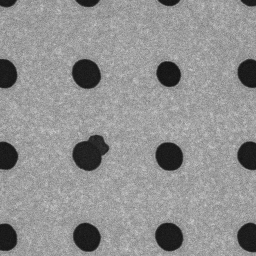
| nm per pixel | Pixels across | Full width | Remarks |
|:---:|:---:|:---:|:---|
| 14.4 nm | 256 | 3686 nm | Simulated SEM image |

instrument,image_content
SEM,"holes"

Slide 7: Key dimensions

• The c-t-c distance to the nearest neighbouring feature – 1150 nm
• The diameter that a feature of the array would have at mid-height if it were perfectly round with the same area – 406 nm